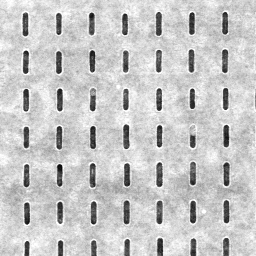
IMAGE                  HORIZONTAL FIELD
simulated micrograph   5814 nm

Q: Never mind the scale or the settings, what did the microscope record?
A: a regular array of holes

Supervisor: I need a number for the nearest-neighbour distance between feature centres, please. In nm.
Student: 750